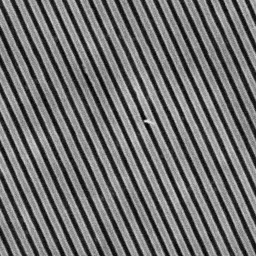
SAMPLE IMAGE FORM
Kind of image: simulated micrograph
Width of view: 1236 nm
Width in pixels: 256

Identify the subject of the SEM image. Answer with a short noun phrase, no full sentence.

parallel lines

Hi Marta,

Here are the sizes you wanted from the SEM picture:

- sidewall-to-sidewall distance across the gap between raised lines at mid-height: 28 nm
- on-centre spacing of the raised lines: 57.2 nanometers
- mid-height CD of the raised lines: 5.9 px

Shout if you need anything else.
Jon